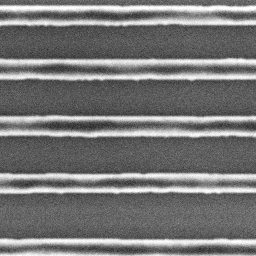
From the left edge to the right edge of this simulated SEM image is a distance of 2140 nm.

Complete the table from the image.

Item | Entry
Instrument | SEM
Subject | lines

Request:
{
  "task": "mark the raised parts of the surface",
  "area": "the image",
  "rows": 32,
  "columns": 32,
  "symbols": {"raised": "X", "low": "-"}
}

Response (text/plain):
--------------------------------
XXXXXXXXXXXXXXXXXXXXXXXXXXXXXXXX
XXXXXXXXXXXXXXXXXXXXXXXXXXXXXXXX
--------------------------------
--------------------------------
--------------------------------
--------------------------------
--------------------------------
XXXXXXXXXXXXXXXXXXXXXXXXXXXXXXXX
XXXXXXXXXXXXXXXXXXXXXXXXXXXXXXXX
--------------------------------
--------------------------------
--------------------------------
--------------------------------
--------------------------------
XXXXXXXXXXXXXXXXXXXXXXXXXXXXXXXX
XXXXXXXXXXXXXXXXXXXXXXXXXXXXXXXX
--------------------------------
--------------------------------
--------------------------------
--------------------------------
--------------------------------
XXXXXXXXXXXXXXXXXXXXXXXXXXXXXXXX
XXXXXXXXXXXXXXXXXXXXXXXXXXXXXXXX
--------------------------------
--------------------------------
--------------------------------
--------------------------------
--------------------------------
--------------------------------
XXXXXXXXXXXXXXXXXXXXXXXXXXXXXXXX
XXXXXXXXXXXXXXXXXXXXXXXXXXXXXXXX